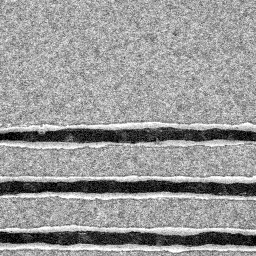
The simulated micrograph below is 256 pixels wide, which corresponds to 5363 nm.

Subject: parallel lines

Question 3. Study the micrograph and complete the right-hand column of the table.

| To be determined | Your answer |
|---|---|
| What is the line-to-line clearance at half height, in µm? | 0.359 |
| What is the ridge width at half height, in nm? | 720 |